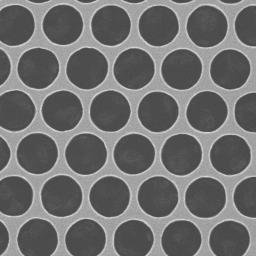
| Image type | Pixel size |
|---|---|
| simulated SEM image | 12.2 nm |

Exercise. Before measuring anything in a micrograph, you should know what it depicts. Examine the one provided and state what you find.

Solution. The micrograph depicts a regular array of holes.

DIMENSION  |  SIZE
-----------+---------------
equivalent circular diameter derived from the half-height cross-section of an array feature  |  500 nanometres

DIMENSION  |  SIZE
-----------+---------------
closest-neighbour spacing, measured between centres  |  0.585 um